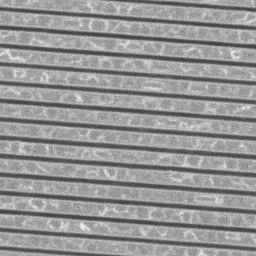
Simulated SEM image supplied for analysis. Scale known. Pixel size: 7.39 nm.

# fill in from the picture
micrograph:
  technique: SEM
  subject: parallel lines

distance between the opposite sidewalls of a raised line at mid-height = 97.6 nanometres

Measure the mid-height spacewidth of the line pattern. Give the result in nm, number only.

33.1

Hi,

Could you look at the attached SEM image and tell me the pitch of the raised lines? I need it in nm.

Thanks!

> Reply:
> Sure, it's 136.